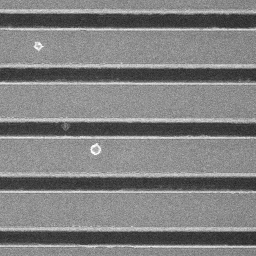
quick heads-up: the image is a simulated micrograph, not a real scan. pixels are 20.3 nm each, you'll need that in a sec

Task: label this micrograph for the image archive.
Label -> lines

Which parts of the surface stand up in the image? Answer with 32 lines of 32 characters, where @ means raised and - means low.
--------------------------------
@@@@@@@@@@@@@@@@@@@@@@@@@@@@@@@@
@@@@@@@@@@@@@@@@@@@@@@@@@@@@@@@@
@@@@@@@@@@@@@@@@@@@@@@@@@@@@@@@@
--------------------------------
--------------------------------
--------------------------------
--------------------------------
@@@@@@@@@@@@@@@@@@@@@@@@@@@@@@@@
@@@@@@@@@@@@@@@@@@@@@@@@@@@@@@@@
--------------------------------
--------------------------------
--------------------------------
--------------------------------
--------------------------------
@@@@@@@@@@@@@@@@@@@@@@@@@@@@@@@@
@@@@@@@@@@@@@@@@@@@@@@@@@@@@@@@@
--------------------------------
--------------------------------
--------------------------------
--------------------------------
--------------------------------
@@@@@@@@@@@@@@@@@@@@@@@@@@@@@@@@
@@@@@@@@@@@@@@@@@@@@@@@@@@@@@@@@
--------------------------------
--------------------------------
--------------------------------
--------------------------------
--------------------------------
@@@@@@@@@@@@@@@@@@@@@@@@@@@@@@@@
@@@@@@@@@@@@@@@@@@@@@@@@@@@@@@@@
--------------------------------